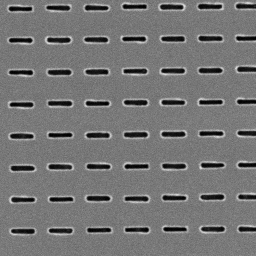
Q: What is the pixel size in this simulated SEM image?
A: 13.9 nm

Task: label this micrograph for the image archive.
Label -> a regular array of holes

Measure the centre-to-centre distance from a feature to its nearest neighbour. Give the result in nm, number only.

439